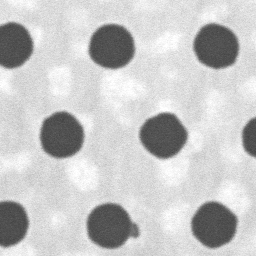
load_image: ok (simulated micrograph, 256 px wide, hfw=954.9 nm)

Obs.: holes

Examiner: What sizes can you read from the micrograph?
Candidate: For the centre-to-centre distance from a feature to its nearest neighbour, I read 102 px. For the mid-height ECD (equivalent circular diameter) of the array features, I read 174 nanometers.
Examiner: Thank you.